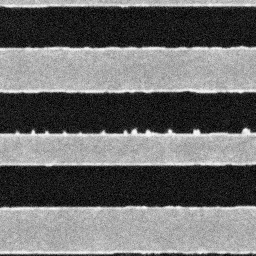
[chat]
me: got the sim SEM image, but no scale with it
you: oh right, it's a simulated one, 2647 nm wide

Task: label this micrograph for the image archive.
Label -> lines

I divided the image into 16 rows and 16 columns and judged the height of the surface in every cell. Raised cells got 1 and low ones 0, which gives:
0000000000000000
0000000000000000
0000000000000000
1111111111111111
1111111111111111
1111111111111111
0000000000000000
0000000000000000
1111111111111111
1111111111111111
0000000000000000
0000000000000000
0000000000000000
1111111111111111
1111111111111111
1111111111111111